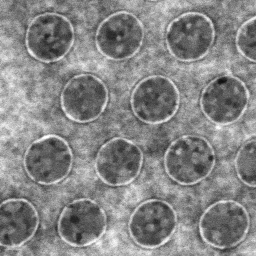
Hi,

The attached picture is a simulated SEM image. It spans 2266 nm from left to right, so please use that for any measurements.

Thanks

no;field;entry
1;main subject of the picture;a regular array of raised bodies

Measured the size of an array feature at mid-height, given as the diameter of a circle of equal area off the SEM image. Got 0.42 um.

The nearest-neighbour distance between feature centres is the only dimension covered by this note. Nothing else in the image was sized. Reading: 621 nm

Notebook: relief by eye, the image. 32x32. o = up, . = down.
................................
................................
....oooo.....oooo.....oooo.....o
....ooooo...oooooo...oooooo...oo
...oooooo...oooooo...oooooo...oo
...oooooo...oooooo...ooooo....oo
....oooo.....oooo....ooooo....oo
.....oo................o.......o
................................
..........oo................o...
........ooooo....ooooo....oooo..
........ooooo....ooooo...oooooo.
........ooooo....ooooo...oooooo.
........ooooo....ooooo...oooooo.
.........ooo.....oooo.....oooo..
................................
................................
.....ooo......oo......oooo......
....ooooo....oooo....ooooo....oo
...oooooo...oooooo...oooooo...oo
...oooooo...oooooo...oooooo..ooo
...oooooo...ooooo....ooooo....oo
....ooo......oooo.....ooo.....oo
................................
................................
oooo.....ooo......ooo......ooo..
oooo....ooooo....ooooo....ooooo.
ooooo..oooooo...oooooo...oooooo.
oooo...oooooo...oooooo...oooooo.
oooo....ooooo....oooo....oooooo.
ooo......oo......ooo......oooo..
................................